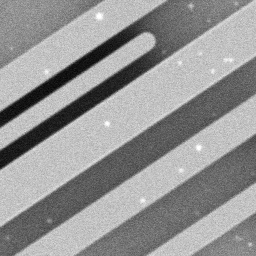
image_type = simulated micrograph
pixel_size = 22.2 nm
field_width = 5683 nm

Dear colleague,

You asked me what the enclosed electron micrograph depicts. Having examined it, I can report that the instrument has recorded groups of lines, slits or small figures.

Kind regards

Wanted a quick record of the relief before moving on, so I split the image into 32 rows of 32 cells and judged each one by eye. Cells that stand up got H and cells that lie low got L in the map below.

LLLLLLLLLLLLHHHHHHHHLLLLLLLLLLLH
LLLLLLLLLLLHHHHHHHLLLLLLLLLLLLHH
LLLLLLLLLHHHHHHHHLLLLLLLLLLLHHHH
LLLLLLLLHHHHHHHHLLLLLLLLLLLHHHHH
LLLLLLHHHHHHHHLLLHHLLLLLLHHHHHHH
LLLLLHHHHHHHHLLLHHHLLLLLHHHHHHHH
LLLHHHHHHHHLLLHHHHLLLLHHHHHHHHHH
LLHHHHHHHHLLLHHHHLLLLHHHHHHHHHHL
LHHHHHHHLLLHHHHLLLLHHHHHHHHHHHLL
HHHHHHHLLLHHHHLLLLHHHHHHHHHHLLLL
HHHHHLLLHHHHLLLLHHHHHHHHHHHLLLLL
HHHHLLLHHHHLLLLHHHHHHHHHHLLLLLLL
HHLLLHHHHLLLLHHHHHHHHHHHLLLLLLLH
HLLLHHHHLLLLHHHHHHHHHHLLLLLLLLHH
LLHHHHLLLLHHHHHHHHHHHLLLLLLLHHHH
LHHHHLLLLHHHHHHHHHHLLLLLLLLHHHHH
HHHLLLLHHHHHHHHHHHLLLLLLLHHHHHHH
HHLLLLHHHHHHHHHHLLLLLLLHHHHHHHHL
LLLLHHHHHHHHHHHLLLLLLLHHHHHHHLLL
LLLHHHHHHHHHHLLLLLLLLHHHHHHHLLLL
LHHHHHHHHHHHLLLLLLLHHHHHHHLLLLLL
HHHHHHHHHHLLLLLLLLHHHHHHHLLLLLLL
HHHHHHHHHLLLLLLLHHHHHHHLLLLLLLLL
HHHHHHHLLLLLLLLHHHHHHHLLLLLLLLLH
HHHHHHLLLLLLLHHHHHHHLLLLLLLLLLHH
HHHHLLLLLLLLHHHHHHHLLLLLLLLLHHHH
HHHLLLLLLLHHHHHHHLLLLLLLLLLHHHHH
HLLLLLLLLHHHHHHHLLLLLLLLLHHHHHLL
LLLLLLLHHHHHHHLLLLLLLLLLHHHHHLLL
LLLLLLHHHHHHHLLLLLLLLLHHHHHLLLLL
LLLLHHHHHHHLLLLLLLLLLHHHHHLLLLLL
LLLHHHHHHHLLLLLLLLLHHHHHLLLLLLLL